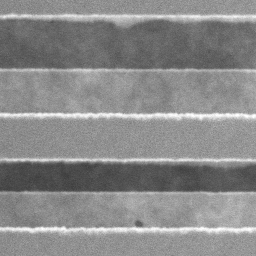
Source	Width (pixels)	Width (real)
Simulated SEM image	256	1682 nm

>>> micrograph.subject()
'lines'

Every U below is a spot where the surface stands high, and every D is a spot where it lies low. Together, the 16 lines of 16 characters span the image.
UUUUUUUUUUUUUUUU
DDDDDDDDDDDDDDDD
DDDDDDDDDDDDDDDD
DDDDDDDDDDDDDDDD
UUUUUUUUUUUUUUUU
UUUUUUUUUUUUUUUU
UUUUUUUUUUUUUUUU
UUUUUUUUUUUUUUUU
UUUUUUUUUUUUUUUU
UUUUUUUUUUUUUUUU
DDDDDDDDDDDDDDDD
DDDDDDDDDDDDDDDD
UUUUUUUUUUUUUUUU
UUUUUUUUUUUUUUUU
UUUUUUUUUUUUUUUU
UUUUUUUUUUUUUUUU